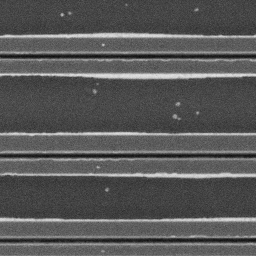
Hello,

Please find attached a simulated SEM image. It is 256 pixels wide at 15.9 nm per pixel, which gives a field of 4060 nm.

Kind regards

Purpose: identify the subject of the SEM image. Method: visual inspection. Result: lines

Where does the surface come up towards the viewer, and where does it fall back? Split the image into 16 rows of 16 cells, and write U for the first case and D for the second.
DDDDDDDDDDDDDDDD
DDDDDDDDDDDDDDDD
UUUUUUUUUUUUUUUU
UUUUUUUUUUUUUUUU
UUUUUUUUUUUUUUUU
DDDDDDDDDDDDDDDD
DDDDDDDDDDDDDDDD
DDDDDDDDDDDDDDDD
UUUUUUUUUUUUUUUU
UUUUUUUUUUUUUUUU
UUUUUUUUUUUUUUUU
DDDDDDDDDDDDDDDD
DDDDDDDDDDDDDDDD
DDDDDDDDDDDDDDDD
UUUUUUUUUUUUUUUU
UUUUUUUUUUUUUUUU